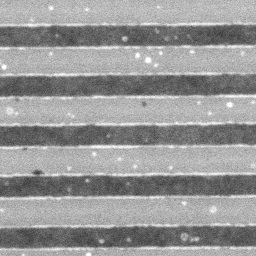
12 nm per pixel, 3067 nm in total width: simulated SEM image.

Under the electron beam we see lines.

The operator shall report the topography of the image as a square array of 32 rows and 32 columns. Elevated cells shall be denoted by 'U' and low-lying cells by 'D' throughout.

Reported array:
DDDDDDDDDDDDDDDDDDDDDDDDDDDDDDDD
DDDDDDDDDDDDDDDDDDDDDDDDDDDDDDDD
DDDDDDDDDDDDDDDDDDDDDDDDDDDDDDDD
UUUUUUUUUUUUUUUUUUUUUUUUUUUUUUUU
UUUUUUUUUUUUUUUUUUUUUUUUUUUUUUUU
UUUUUUUUUUUUUUUUUUUUUUUUUUUUUUUU
DDDDDDDDDDDDDDDDDDDDDDDDDDDDDDDD
DDDDDDDDDDDDDDDDDDDDDDDDDDDDDDDD
DDDDDDDDDDDDDDDDDDDDDDDDDDDDDDDD
UUUUUUUUUUUUUUUUUUUUUUUUUUUUUUUU
UUUUUUUUUUUUUUUUUUUUUUUUUUUUUUUU
UUUUUUUUUUUUUUUUUUUUUUUUUUUUUUUU
DDDDDDDDDDDDDDDDDDDDDDDDDDDDDDDD
DDDDDDDDDDDDDDDDDDDDDDDDDDDDDDDD
DDDDDDDDDDDDDDDDDDDDDDDDDDDDDDDD
DDDDDDDDDDDDDDDDDDDDDDDUUDUUUUUU
UUUUUUUUUUUUUUUUUUUUUUUUUUUUUUUU
UUUUUUUUUUUUUUUUUUUUUUUUUUUUUUUU
DDDDDDDDDDDDDDDDDDDDDDDDDDDDDDDD
DDDDDDDDDDDDDDDDDDDDDDDDDDDDDDDD
DDDDDDDDDDDDDDDDDDDDDDDDDDDDDDDD
DDDDDDDDDDDDDDDDDDDDDDDDDDDDDDDD
UUUUUUUUUUUUUUUUUUUUUUUUUUUUUUUU
UUUUUUUUUUUUUUUUUUUUUUUUUUUUUUUU
UUUUUUUUUUUUUUUUUUUUUUUUUUUUUUUU
DDDDDDDDDDDDDDDDDDDDDDDDDDDDDDDD
DDDDDDDDDDDDDDDDDDDDDDDDDDDDDDDD
DDDDDDDDDDDDDDDDDDDDDDDDDDDDDDDD
UUUUUUUUUUUUUUUUUUUUUUUUUUUUUUUU
UUUUUUUUUUUUUUUUUUUUUUUUUUUUUUUU
UUUUUUUUUUUUUUUUUUUUUUUUUUUUUUUU
DDDDDDDDDDDDDDDDDDDDDDDDDDDDDDDD